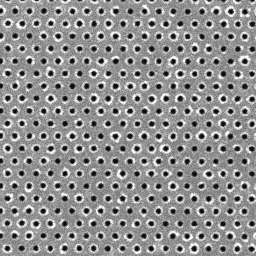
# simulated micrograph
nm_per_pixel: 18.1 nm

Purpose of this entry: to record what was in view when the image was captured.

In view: a regular array of holes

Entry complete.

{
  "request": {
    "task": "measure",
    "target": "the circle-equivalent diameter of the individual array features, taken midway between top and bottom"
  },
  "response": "112 nanometers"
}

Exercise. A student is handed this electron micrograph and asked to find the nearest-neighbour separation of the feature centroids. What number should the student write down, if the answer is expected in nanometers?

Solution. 253